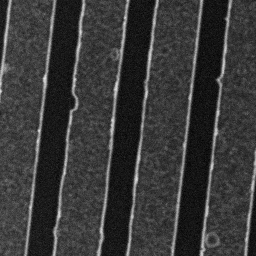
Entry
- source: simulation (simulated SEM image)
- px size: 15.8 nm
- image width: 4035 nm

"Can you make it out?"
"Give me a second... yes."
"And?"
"one or a few lines or trenches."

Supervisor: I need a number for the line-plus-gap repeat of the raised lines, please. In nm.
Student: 1150